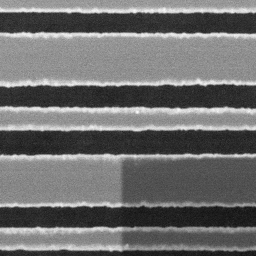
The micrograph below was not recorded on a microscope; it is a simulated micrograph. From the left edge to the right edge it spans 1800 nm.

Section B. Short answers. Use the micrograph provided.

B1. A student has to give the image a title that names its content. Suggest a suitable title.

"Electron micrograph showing lines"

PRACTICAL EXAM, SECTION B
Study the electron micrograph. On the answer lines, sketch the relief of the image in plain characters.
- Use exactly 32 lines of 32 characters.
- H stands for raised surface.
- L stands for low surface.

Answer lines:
HHHHHHHHHHHHHHHHHHHHHHHHHHHHHHHH
LLLLLLLLLLLLLLLHLLLLLLLLLLLHLLLL
LLLLLLLLLLLLLLLLLLLLLLLLLLLLLLLL
LLLLLLLLLLLLLLLLLLLLLLLLLLLLLLLL
HHHHHHHHHHHHHHHHHHHHHHHHHHHHHHHH
HHHHHHHHHHHHHHHHHHHHHHHHHHHHHHHH
HHHHHHHHHHHHHHHHHHHHHHHHHHHHHHHH
HHHHHHHHHHHHHHHHHHHHHHHHHHHHHHHH
HHHHHHHHHHHHHHHHHHHHHHHHHHHHHHHH
HHHHHHHHHHHHHHHHHHHHHHHHHHHHHHHH
HHHHHHHHHHHHHHHHHHHHHHHHLHLLLHHH
LLLLLLLLLLLLLLLLLLLLLLLLLLLLLLLL
LLLLLLLLLLLLLLLLLLLLLLLLLLLLLLLL
HHLLHLHLLLLLLLLLLLLLLLLLLLLLLLLL
HHHHHHHHHHHHHHHHHHHHHHHHHHHHHHHH
HHHHHHHHHHHHHHHHHHHHHHHHHHHHHHHH
LLLLLLLLLLLLLLLLLLLLLLLLLLLLLLLL
LLLLLLLLLLLLLLLLLLLLLLLLLLLLLLLL
LLLLLLLLLLLLLLLLLLLLLLLLLLLLLLLL
LHHLLHHLHHHHHHLHHLLHHHHHHHHHHHHH
HHHHHHHHHHHHHHHHHHHHHHHHHHHHHHHH
HHHHHHHHHHHHHHHHHHHHHHHHHHHHHHHH
HHHHHHHHHHHHHHHHHHHHHHHHHHHHHHHH
HHHHHHHHHHHHHHHHHHHHHHHHHHHHHHHH
HHHHHHHHHHHHHHHHHHHHHHHHHHHHHHHH
HHHHHHHHHHHHHHHHHHHHHHHHHHHHHHHH
LLLLLLLLLLLLLLLLLLLLLLLLLLLLLLLL
LLLLLLLLLLLLLLLLLLLLLLLLLLLLLLLL
LLLLLLLLLLLLHLLHHHHHLHLLLLHHLLLL
HHHHHHHHHHHHHHHHHHHHHHHHHHHHHHHH
HHHHHHHHHHHHHHHHHHHHHHHHHHHHHHHH
LLLLLLLLLLLLLLLLLLLLLLLLLLLLLLLL